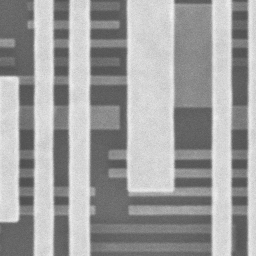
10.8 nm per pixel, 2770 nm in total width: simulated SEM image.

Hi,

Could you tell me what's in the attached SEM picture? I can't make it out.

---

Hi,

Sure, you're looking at wiring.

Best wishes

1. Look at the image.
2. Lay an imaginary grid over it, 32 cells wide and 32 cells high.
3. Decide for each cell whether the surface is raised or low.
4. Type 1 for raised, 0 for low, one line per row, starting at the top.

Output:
00001110011000001111110000011001
00001110011000001111110000011001
00001110011000001111110000011001
00001110011000001111110000011001
00001110011000001111110000011001
00001110011000001111110000011001
00001110011000001111110000011001
00001110011000001111110000011001
00001110011000001111110000011001
00001110011000001111110000011001
11001110011000001111110000011001
11001110011000001111110000011001
11001110011000001111110000011001
11001110011000001111110000011001
11001110011000001111110000011001
11001110011000001111110000011001
11001110011000001111110000011001
11001110011000001111110000011001
11001110011000001111110000011001
11001100011000001111110000011001
11001110011000001111110000011001
11001110011000001111110000011001
11001110011000001111110000011001
11001110011000001111110000011001
11001110011000000000000000011001
11001110011000000000000000011001
11001110011000000000000000011001
11001110011000000000000000011001
00001110011000000000000000011001
00001110011000000000000000011001
00001110011000000000000000011001
00001110011000000000000000011001